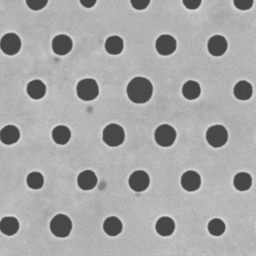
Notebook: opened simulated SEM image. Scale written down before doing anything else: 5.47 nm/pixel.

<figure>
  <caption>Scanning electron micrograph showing a regular array of holes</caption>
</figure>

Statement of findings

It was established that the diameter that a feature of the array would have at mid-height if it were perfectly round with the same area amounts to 111 nanometers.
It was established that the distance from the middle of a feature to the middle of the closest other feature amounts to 282 nm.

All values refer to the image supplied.